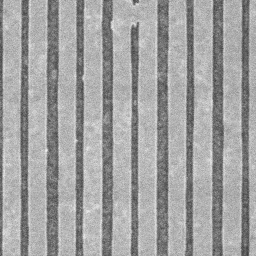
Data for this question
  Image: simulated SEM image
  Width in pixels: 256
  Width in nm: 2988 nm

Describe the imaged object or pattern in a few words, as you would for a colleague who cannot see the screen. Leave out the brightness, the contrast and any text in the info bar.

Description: parallel lines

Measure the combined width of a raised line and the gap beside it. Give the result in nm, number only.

322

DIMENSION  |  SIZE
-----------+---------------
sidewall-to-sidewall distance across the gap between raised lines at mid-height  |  99.2 nm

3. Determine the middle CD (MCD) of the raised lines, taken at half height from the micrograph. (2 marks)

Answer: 17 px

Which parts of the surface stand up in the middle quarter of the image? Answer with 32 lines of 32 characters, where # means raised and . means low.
###..####...#####..####...####..
###..####...#####..####...####..
###..####...#####..####...####..
###..####...#####..####...####..
###..####...#####..####...####..
###..####...#####..####...####..
###..####...#####..####...####..
###..####....####..####...####..
###..####....####..####...####..
###..####...#####..####...####..
###..####...#####..####...####..
###..####...#####..####...####..
###..####...#####..####...####..
###..######..####..####...####..
###..####.#..####..####...####..
###..####....####..####...####..
###..####....####..####...####..
###..####....####..####...####..
###..####....####..####...####..
###..####....####..####...####..
###..####....####..####...####..
###..####....####..####...####..
###..####....####..####...####..
###..####....####..####...####..
###..####....####..####...####..
###..####....####..####...####..
###..####....####..####...####..
###..####....####..####...####..
###..####....####..####...####..
###..####....####..####...####..
###..####....####..####...####..
###..####....####..####...####..